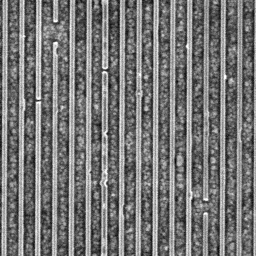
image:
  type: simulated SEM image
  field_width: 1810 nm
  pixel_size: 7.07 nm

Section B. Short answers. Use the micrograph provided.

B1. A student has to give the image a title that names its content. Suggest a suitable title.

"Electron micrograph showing parallel lines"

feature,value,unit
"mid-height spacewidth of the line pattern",88.3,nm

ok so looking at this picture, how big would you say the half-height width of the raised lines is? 27.4 nm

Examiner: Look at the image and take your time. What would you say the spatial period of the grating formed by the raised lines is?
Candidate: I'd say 118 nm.